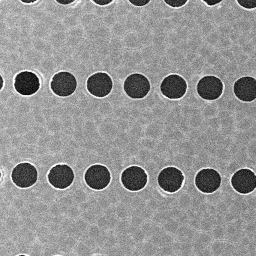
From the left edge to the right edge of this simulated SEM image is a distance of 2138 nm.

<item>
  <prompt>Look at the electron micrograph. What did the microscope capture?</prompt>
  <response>a regular array of holes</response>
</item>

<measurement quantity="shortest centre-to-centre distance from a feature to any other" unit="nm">304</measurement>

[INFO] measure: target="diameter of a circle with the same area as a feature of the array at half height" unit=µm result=0.213